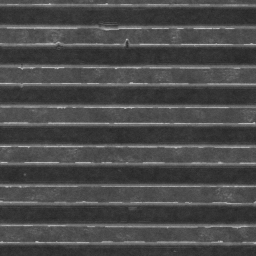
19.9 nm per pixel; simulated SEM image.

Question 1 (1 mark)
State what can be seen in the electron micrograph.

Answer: parallel lines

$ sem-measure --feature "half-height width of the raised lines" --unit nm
374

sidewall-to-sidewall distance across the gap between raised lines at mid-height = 414 nanometres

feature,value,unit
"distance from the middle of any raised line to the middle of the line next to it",790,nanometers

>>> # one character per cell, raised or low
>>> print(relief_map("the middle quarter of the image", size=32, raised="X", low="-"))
--------------------------------
XXXXXXXXXXXXXXXXXXXXXXXXXXXXXXXX
XXXXXXXXXXXXXXXXXXXXXXXXXXXXXXXX
XXXXXXXXXXXXXXXXXXXXXXXXXXXXXXXX
XXXXXXXXXXXXXXXXXXXXXXXXXXXXXXXX
--------------------------------
--------------------------------
--------------------------------
--------------------------------
--------------------------------
--------------------------------
XXXXXXXXXXXXXXXXXXXXXXXXXXXXXXXX
XXXXXXXXXXXXXXXXXXXXXXXXXXXXXXXX
XXXXXXXXXXXXXXXXXXXXXXXXXXXXXXXX
XXXXXXXXXXXXXXXXXXXXXXXXXXXXXXXX
--------------------------------
--------------------------------
--------------------------------
--------------------------------
--------------------------------
----XXXXXXXXXXXXXXXXXXX---------
XXXXXXXXXXXXXXXXXXXXXXXXXXXXXXXX
XXXXXXXXXXXXXXXXXXXXXXXXXXXXXXXX
XXXXXXXXXXXXXXXXXXXXXXXXXXXXXXXX
XXXXXXXXXXXXXXXXXXXXXXXXXXXXXXXX
--------------------------------
--------------------------------
--------------------------------
--------------------------------
--------------------------------
--XXXXXXXXXXXXXXXXXXXXXXXXXXXXXX
XXXXXXXXXXXXXXXXXXXXXXXXXXXXXXXX